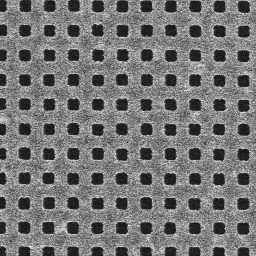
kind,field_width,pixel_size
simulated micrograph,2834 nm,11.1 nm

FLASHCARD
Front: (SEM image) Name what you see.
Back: a regular array of holes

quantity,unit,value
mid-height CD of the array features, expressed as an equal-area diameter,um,0.148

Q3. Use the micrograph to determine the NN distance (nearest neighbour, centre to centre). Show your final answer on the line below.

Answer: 266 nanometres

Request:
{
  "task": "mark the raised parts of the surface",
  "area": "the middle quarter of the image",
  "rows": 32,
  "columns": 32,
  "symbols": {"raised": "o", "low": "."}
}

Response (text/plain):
oooooooooooooooooooooooooooooooo
oooooooooooooooooooooooooooooooo
o..ooooo.oooo...oooooooooooooooo
o...ooo...ooo...ooo...ooo...ooo.
o...ooo...ooo...ooo...ooo...ooo.
o...ooo...oooo.oooo...oooo..oooo
oooooooooooooooooooooooooooooooo
oooooooooooooooooooooooooooooooo
oooooooooooooooooooooooooo.ooooo
o...ooo...ooo...ooo...ooo...ooo.
o...ooo...ooo...ooo...ooo...ooo.
oo.oooo...ooo...ooo...ooo...oooo
oooooooooooooooooooooooooooooooo
oooooooooooooooooooooooooooooooo
oooooooooooooooooooooooooooooooo
o...ooo...ooo...ooo...ooo...ooo.
o...ooo...ooo...ooo...ooo...ooo.
o...ooo...ooo...ooo...ooo...ooo.
oooooooooooooooooooooooooooooooo
oooooooooooooooooooooooooooooooo
oooooooooooooooooooooooooooooooo
o...ooo...ooo...ooo...ooo...ooo.
o...ooo...ooo...ooo...ooo...ooo.
o...ooo...ooo...ooo...ooo...ooo.
oooooooooooooooooooooooooooooooo
oooooooooooooooooooooooooooooooo
oooooooooooooooooooooooooooooooo
o...ooo...ooo...ooo...ooo...oooo
o...ooo...ooo...ooo...ooo...ooo.
o...ooo...ooo...ooo...ooo...ooo.
oooooooooooooooooooooooooooooooo
oooooooooooooooooooooooooooooooo